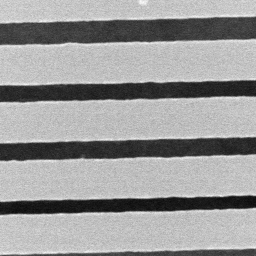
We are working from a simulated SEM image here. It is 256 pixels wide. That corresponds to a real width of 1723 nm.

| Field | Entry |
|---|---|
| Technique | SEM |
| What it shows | lines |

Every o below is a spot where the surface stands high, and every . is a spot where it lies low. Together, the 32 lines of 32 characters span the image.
oooooooooooooooooooooooooooooooo
oooooooooooooooooooooooooooooooo
oooooooooooo....................
................................
................................
.......ooooooooooooooooooooooooo
oooooooooooooooooooooooooooooooo
oooooooooooooooooooooooooooooooo
oooooooooooooooooooooooooooooooo
oooooooooooooooooooooooooooooooo
oooooo..........................
................................
............oooooooooooooooooooo
oooooooooooooooooooooooooooooooo
oooooooooooooooooooooooooooooooo
oooooooooooooooooooooooooooooooo
oooooooooooooooooooooooooooooooo
oooooooooooooooo................
................................
.............................ooo
oooooooooooooooooooooooooooooooo
oooooooooooooooooooooooooooooooo
oooooooooooooooooooooooooooooooo
oooooooooooooooooooooooooooooooo
ooooooooooooooooooooooooooooo...
................................
....................oooooooooooo
oooooooooooooooooooooooooooooooo
oooooooooooooooooooooooooooooooo
oooooooooooooooooooooooooooooooo
oooooooooooooooooooooooooooooooo
oooooooooooooo..................